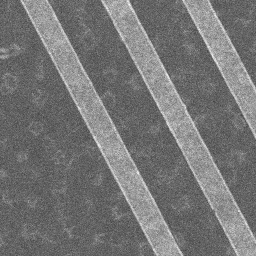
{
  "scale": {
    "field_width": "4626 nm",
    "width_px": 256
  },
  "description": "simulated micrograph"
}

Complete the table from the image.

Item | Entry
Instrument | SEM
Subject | one or a few lines or trenches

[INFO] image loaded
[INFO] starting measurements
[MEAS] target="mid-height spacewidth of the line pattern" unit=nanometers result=880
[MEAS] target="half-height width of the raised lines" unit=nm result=401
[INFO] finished